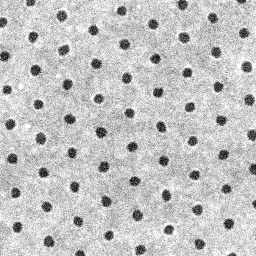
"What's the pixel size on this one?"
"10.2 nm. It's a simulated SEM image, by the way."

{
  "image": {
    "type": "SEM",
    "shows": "a regular array of holes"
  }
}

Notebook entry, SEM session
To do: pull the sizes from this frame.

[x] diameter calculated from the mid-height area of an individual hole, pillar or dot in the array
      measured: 0.119 microns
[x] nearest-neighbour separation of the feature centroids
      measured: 33.8 px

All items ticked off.